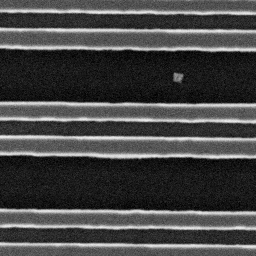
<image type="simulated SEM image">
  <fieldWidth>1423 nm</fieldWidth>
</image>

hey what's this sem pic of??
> lines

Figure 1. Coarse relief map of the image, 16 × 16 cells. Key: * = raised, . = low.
****************
****************
****************
................
................
................
*****...........
****************
****************
****************
................
................
................
****************
****************
****************